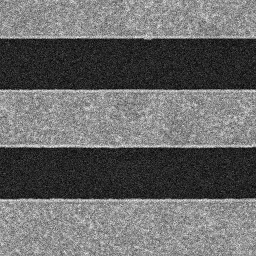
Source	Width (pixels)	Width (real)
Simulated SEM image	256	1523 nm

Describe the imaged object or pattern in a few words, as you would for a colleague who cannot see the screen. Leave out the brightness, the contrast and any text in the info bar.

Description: one or a few lines or trenches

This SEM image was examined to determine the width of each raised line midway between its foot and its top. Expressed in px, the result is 56.5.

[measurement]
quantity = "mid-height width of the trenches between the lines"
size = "316 nm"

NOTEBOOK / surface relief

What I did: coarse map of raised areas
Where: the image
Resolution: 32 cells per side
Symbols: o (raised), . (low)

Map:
oooooooooooooooooooooooooooooooo
oooooooooooooooooooooooooooooooo
oooooooooooooooooooooooooooooooo
oooooooooooooooooooooooooooooooo
oooooooooooooooooooooooooooooooo
................................
................................
................................
................................
................................
................................
oooooooooooooooooooooooooooooooo
oooooooooooooooooooooooooooooooo
oooooooooooooooooooooooooooooooo
oooooooooooooooooooooooooooooooo
oooooooooooooooooooooooooooooooo
oooooooooooooooooooooooooooooooo
oooooooooooooooooooooooooooooooo
................................
................................
................................
................................
................................
................................
................................
oooooooooooooooooooooooooooooooo
oooooooooooooooooooooooooooooooo
oooooooooooooooooooooooooooooooo
oooooooooooooooooooooooooooooooo
oooooooooooooooooooooooooooooooo
oooooooooooooooooooooooooooooooo
oooooooooooooooooooooooooooooooo